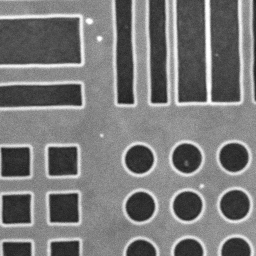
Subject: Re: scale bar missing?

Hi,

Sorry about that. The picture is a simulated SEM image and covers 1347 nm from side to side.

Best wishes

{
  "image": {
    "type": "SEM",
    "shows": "groups of lines, slits or small figures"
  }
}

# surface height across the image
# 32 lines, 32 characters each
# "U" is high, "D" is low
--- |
UUUUUUUUUUUUUUDDDUUDDUDDDDDDDDUD
UUUUUUUUUUUUUUDDDUUDDUDDDDDDDDUD
DDDDDDDDDDUUUUDDDUUDDUDDDDDDDDUD
DDDDDDDDDDUUUUDDDUUDDUDDDDDDDDUD
DDDDDDDDDDUUUUDDDUUDDUDDDDDDDDUU
DDDDDDDDDDUUUUDDDUUDDUDDDDDDDDUU
DDDDDDDDDDUUUUDDDUUDDUDDDDDDDDUU
DDDDDDDDDDUUUUDDDUUDDUDDDDDDDDUU
UUUUUUUUUUUUUUDDDUUDDUDDDDDDDDUU
UUUUUUUUUUUUUUDDDUUDDUDDDDDDDDUU
UUDDDDDDDDUUUUDDDUUDDUDDDDDDDDUU
DDDDDDDDDDUUUUUDDUUDDUDDDDDDDDUU
DDDDDDDDDDUUUUUDDUUDDUDDDDDDDDUU
DDDUUUUUUUUUUUUUUUUUUUUUUUUUUUUU
UUUUUUUUUUUUUUUUUUUUUUUUUUUUUUUU
UUUUUUUUUUUUUUUUUUUUUUUUUUUUUUUU
UUUUUUUUUUUUUUUUUUUUUUUUUUUUUUUU
UUUUUUUUUUUUUUUUUUUUUUUUUUUUUUUU
DDDDUUDDDDUUUUUUDDDUUUDDDUUUDDDU
DDDDUUDDDDUUUUUUDDDUUUDDDUUDDDDU
DDDDUUDDDDUUUUUUDDDUUUDDDUUUDDDU
DDDDUUDDDDUUUUUUDDUUUUDDUUUUUDUU
UUUUUUUUUUUUUUUUUUUUUUUUUUUUUUUU
UUUUUUUUUUUUUUUUUUUUUUUUUUUUUUUU
DDDDUUDDDDUUUUUUDDDUUUDDDUUUDDDU
DDDDUUDDDDUUUUUUDDDUUUDDDUUDDDDU
DDDDUUDDDDUUUUUUDDDUUUDDDUUUDDDU
DDDDUUDDDDUUUUUUUDDUUUUDUUUUUDUU
UUUUUUUUUUUUUUUUUUUUUUUUUUUUUUUU
UUUUUUUUUUUUUUUUUUUUUUUUUUUUUUUU
DDDDUUDDDDUUUUUUDDDUUUDDDUUUDDDU
DDDDUUDDDDUUUUUUDDDDUUDDDUUUDDDU